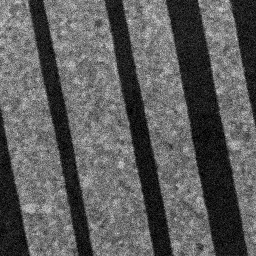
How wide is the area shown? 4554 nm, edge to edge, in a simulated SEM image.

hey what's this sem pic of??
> one or a few lines or trenches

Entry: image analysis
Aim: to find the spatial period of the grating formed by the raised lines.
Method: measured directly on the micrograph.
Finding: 1220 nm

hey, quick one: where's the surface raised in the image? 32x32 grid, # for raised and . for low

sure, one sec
####..#######..######....####...
####..#######...#####....####...
####..########..#####....####...
####..########..#####.....###...
####..########..######....####..
#####..#######..######....####..
#####..#######...#####....####..
#####..#######...#####....####..
#####..########..#####....####..
#####..########..######....####.
#####...#######..######....####.
######..#######...#####....####.
######..#######...#####....####.
######..########..#####....####.
######..########..#####.....####
.######..#######..######....####
.######..#######...#####....####
.######..#######...#####....####
.######..########..#####....####
.######..########..#####.....###
.#######..#######...#####....###
..######..#######...#####....###
..######..#######...#####....###
..######..########..#####....###
..######..########..#####.....##
...######..#######..######....##
...######..#######...#####....##
...######..#######...#####....##
...######..########..#####....##
...######..########..#####.....#
....#####..########..######....#
....######..#######...#####....#